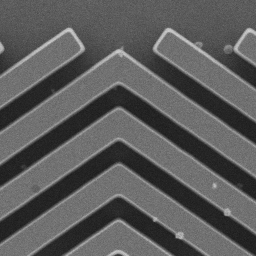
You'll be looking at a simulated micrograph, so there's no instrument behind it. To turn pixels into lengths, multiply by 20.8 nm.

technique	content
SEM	groups of lines, slits or small figures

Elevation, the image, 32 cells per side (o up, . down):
................................
................................
................................
................................
.......oo...........oo........oo
......oooo..........oooo......oo
....oooooo..........ooooo.....oo
...oooooo....oooo....oooooo....o
.oooooo.....oooooo....oooooo....
oooooo....oooooooooo....oooooo..
ooooo....oooooooooooo....oooooo.
ooo....oooooo....ooooo.....ooooo
oo....oooooo......oooooo....oooo
....oooooo.........oooooo.....oo
...oooooo....oooo....oooooo....o
..ooooo.....oooooo....oooooo....
oooooo....oooooooooo....oooooo..
oooo.....oooooooooooo....oooooo.
ooo....oooooo....ooooo.....ooooo
oo....oooooo......oooooo....oooo
....oooooo.........oooooo.....oo
...oooooo....oooo....oooooo....o
..ooooo.....oooooo....oooooo....
oooooo....ooooooooo.....oooooo..
oooo.....oooooooooooo....oooooo.
ooo....oooooo....ooooo.....ooooo
oo....oooooo......oooooo....oooo
....oooooo.........oooooo....ooo
...oooooo....oooo....oooooo....o
.oooooo....ooooooo....oooooo....
oooooo....ooooooooo.....oooooo..
oooo.....oooooooooooo....oooooo.